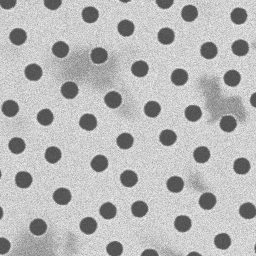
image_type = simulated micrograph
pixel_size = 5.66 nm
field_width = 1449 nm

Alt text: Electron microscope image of a regular array of holes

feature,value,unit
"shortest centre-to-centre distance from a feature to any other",198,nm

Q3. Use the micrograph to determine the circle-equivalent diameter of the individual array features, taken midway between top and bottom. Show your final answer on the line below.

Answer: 96.8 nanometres